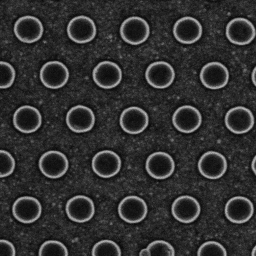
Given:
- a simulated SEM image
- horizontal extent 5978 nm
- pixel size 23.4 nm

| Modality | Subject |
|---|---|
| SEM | a regular array of raised bodies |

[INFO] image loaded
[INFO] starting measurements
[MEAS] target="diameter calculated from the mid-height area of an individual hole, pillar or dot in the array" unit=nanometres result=606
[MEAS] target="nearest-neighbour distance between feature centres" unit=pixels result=51.7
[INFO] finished